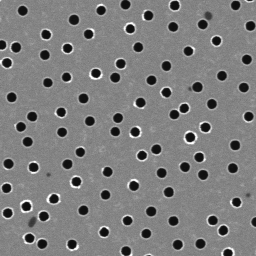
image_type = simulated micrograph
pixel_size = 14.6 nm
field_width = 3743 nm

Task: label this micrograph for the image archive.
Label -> a regular array of holes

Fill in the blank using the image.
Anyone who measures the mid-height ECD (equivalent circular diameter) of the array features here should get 0.144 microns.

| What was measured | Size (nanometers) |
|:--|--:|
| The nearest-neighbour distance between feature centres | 301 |